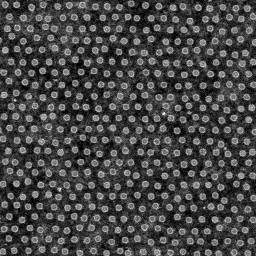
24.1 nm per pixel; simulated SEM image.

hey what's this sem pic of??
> a regular array of raised bodies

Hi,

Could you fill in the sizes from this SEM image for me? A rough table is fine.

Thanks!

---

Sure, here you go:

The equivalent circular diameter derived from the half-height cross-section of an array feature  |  139 nanometers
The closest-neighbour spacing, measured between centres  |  268 nanometers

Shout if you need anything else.